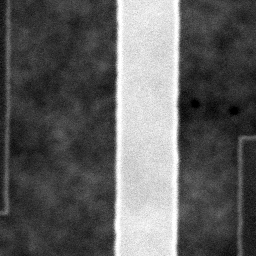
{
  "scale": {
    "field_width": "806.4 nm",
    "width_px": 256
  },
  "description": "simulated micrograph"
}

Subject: wiring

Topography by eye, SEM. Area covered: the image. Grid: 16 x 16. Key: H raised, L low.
HLLLLLLHHHHLLLLL
HLLLLLLHHHHLLLLL
HLLLLLLHHHHLLLLL
HLLLLLLHHHHLLLLL
HLLLLLLHHHHLLLLL
HLLLLLLHHHHLLLLL
HLLLLLLHHHHLLLLL
HLLLLLLHHHHLLLLL
HLLLLLLHHHHLLLLL
LLLLLLLHHHHLLLLH
LLLLLLLHHHHLLLLH
LLLLLLLHHHHLLLLH
LLLLLLLHHHHLLLLH
LLLLLLLHHHHLLLLH
LLLLLLLHHHHLLLLH
LLLLLLLHHHHLLLLH